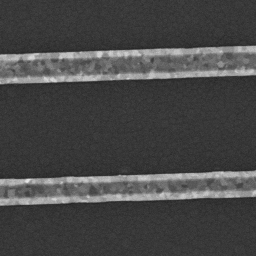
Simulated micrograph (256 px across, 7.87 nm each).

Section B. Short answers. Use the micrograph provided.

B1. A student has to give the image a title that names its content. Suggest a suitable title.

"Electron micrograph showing one or a few lines or trenches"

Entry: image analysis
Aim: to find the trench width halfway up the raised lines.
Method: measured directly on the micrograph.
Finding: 791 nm